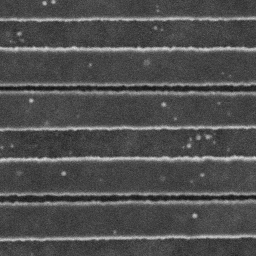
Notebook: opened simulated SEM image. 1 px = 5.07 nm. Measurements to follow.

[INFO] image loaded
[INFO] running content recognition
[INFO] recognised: lines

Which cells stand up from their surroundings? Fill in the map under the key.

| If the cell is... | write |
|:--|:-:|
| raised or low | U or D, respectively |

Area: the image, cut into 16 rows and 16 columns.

UUUUUUUUUUUUUUUU
DDDDDDDDDDDDDDDD
DDDDDDDDDDDDDDDD
UUUUUUUUUUUUUUUU
UUUUUUUUUUUUUUUU
UUUUUUUUUUUUUUUU
UUUUUUUUUUUUUUUU
UUUUUUUUUUUUUUUU
DDDDDDDDDDDDDDDD
DDDDDDDDDDDDDDDD
UUUUUUUUUUUUUUUU
UUUUUUUUUUUUUUUU
UUUUUUUUUUUUUUUU
UUUUUUUUUUUUUUUU
UUUUUUUUUUUUUUUU
DDDDDDDDDDDDDDDD